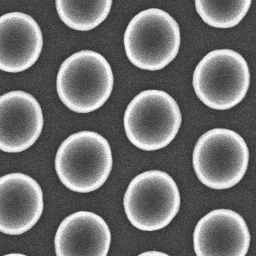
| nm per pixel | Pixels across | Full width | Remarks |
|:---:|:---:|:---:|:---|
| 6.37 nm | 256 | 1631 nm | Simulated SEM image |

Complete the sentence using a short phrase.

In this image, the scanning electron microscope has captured raised bodies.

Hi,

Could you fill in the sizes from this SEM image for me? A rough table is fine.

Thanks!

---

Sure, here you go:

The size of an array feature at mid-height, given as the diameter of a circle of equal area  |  346 nanometres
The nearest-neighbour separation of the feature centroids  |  78.3 pixels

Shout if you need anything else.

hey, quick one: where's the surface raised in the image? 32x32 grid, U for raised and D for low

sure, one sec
DDDDDDDUUUUUUUDDDDDDDDDDDUUUUUUD
DDDDDDDDUUUUUDDDDDUUDDDDDUUUUUUD
UUUUDDDDUUUUUDDDDUUUUDDDDDUUUUDD
UUUUUDDDDDUDDDDDUUUUUUDDDDDDDDDD
UUUUUDDDDDDDDDDDUUUUUUDDDDDDDDDD
UUUUUDDDDDDDDDDDUUUUUUDDDDDDDDDD
UUUUUDDDDDDDDDDDUUUUUUDDDDDDDDDD
UUUUDDDDDUUUUDDDDUUUUDDDDDUUUUDD
UUUDDDDDUUUUUUDDDDDDDDDDDUUUUUUD
DDDDDDDUUUUUUUDDDDDDDDDDUUUUUUUD
DDDDDDDUUUUUUUDDDDDDDDDDUUUUUUUD
DDDDDDDDUUUUUUDDDDDDDDDDDUUUUUUD
UUUUDDDDUUUUUDDDDUUUUDDDDDUUUUDD
UUUUUDDDDUUUDDDDUUUUUUDDDDDDDDDD
UUUUUDDDDDDDDDDDUUUUUUDDDDDDDDDD
UUUUUDDDDDDDDDDDUUUUUUDDDDDDDDDD
UUUUUDDDDDDDDDDDUUUUUUDDDDDUUDDD
UUUUDDDDDUUUUDDDDUUUUDDDDUUUUUDD
UUUDDDDDUUUUUDDDDDDDDDDDDUUUUUUD
DDDDDDDUUUUUUUDDDDDDDDDDUUUUUUUD
DDDDDDDUUUUUUUDDDDDDDDDDUUUUUUUD
DDDDDDDUUUUUUDDDDDDDDDDDDUUUUUDD
UUUUDDDDUUUUUDDDDUUUUDDDDUUUUUDD
UUUUUDDDDUUUDDDDUUUUUUDDDDDDDDDD
UUUUUDDDDDDDDDDDUUUUUUDDDDDDDDDD
UUUUUDDDDDDDDDDDUUUUUUDDDDDDDDDD
UUUUUDDDDDDDDDDDUUUUUUDDDDDDDDDD
UUUUDDDDUUUUUDDDUUUUUDDDDUUUUUDD
UUUDDDDDUUUUUDDDDDUUDDDDDUUUUUUD
DDDDDDDUUUUUUUDDDDDDDDDDUUUUUUUD
DDDDDDDUUUUUUUDDDDDDDDDDUUUUUUUD
DDDDDDDUUUUUUDDDDDDDDDDDDUUUUUUD